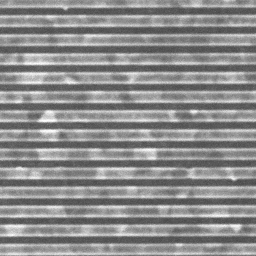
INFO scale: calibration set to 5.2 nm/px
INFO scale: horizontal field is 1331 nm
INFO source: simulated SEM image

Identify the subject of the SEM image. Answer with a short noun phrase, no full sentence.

parallel lines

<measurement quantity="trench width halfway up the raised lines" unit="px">8.75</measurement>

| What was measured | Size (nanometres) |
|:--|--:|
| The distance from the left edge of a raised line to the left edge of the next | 99.1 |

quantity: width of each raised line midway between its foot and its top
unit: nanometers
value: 54